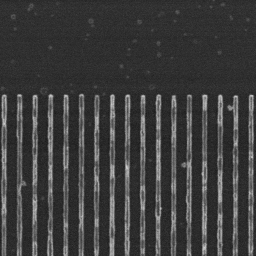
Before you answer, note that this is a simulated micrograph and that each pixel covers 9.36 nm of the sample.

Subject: parallel lines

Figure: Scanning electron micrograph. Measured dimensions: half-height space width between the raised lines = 11.7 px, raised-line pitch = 144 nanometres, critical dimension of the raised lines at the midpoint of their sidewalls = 36.3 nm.